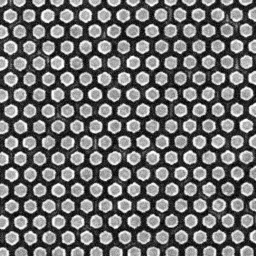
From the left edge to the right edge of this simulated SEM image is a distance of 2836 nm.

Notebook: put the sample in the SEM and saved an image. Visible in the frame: a regular array of raised bodies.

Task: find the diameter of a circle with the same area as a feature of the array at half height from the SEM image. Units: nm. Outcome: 136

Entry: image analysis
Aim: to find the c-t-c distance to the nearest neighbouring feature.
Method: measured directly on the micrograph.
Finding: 202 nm